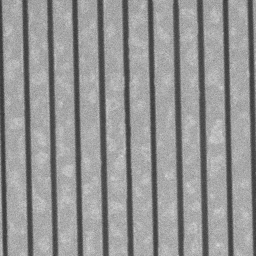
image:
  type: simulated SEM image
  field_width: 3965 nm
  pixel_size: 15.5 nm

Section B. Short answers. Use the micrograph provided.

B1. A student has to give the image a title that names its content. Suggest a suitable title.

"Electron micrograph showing parallel lines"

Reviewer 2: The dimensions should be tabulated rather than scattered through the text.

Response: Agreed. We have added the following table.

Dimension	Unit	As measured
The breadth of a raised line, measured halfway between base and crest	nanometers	306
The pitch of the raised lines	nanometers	388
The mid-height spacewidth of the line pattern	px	5.25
